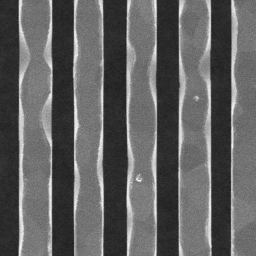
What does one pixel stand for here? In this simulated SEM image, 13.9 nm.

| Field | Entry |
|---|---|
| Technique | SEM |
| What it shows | wiring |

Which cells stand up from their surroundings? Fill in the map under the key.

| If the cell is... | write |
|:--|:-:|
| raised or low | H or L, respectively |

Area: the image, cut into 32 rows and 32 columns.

LLLHHHLLLHHHHLLLHHHLLLLHHHLLLHHH
LLHHHHLLLHHHHLLLHHHLLLLHHHLLLHHH
LLHHHHLLLHHHHLLLHHHHLLHHHHLLLHHH
LLLHHHLLLHHHHLLLHHHLLLHHHHLLLHHH
LLLHHHLLLHHHHLLLHHHLLLHHHHLLLHHH
LLLHHHLLLHHHHLLLHHHLLLHHHHLLLHHH
LLLHHHLLLLHHHLLLHHHLLLHHHHLLLHHH
LLLHHHLLLHHHHLLLHHHLLLLHHHLLLHHH
LLLHHHLLLHHHHLLLHHHLLLLHHLLLLHHH
LLLHHHHLLHHHHLLLHHHLLLLHHHLLLHHH
LLHHHHHLLHHHHLLLHHHLLLLHHHLLLHHH
LLHHHHLLLHHHHLLLHHHLLLLHHHLLLHHH
LLHHHHLLLHHHHLLLHHHLLLLHHHLLLHHH
LLLHHHLLLHHHHLLLHHHHLLLHHHLLLHHH
LLLHHHLLLHHHHLLLHHHHLLLHHHLLLHHH
LLLHHHLLLHHHHLLLHHHHLLLHHHLLLHHH
LLLHHHLLLHHHHLLLHHHHLLLHHHLLLHHH
LLLHHHLLLHHHHLLLHHHHLLLHHHLLLHHH
LLLHHHLLLHHHHLLLHHHLLLLHHHLLLHHH
LLLHHHLLLHHHHLLLHHHLLLHHHHLLLHHH
LLLHHHLLLHHHLLLLHHHLLLHHHHLLLHHH
LLLHHHLLLLHHHLLLHHHLLLHHHHLLLHHH
LLLHHHLLLLHHHLLLHHHLLLHHHHLLLHHH
LLLHHHLLLLHHHLLLHHHLLLHHHHLLLHHH
LLLHHHLLLHHHHLLLHHHLLLHHHHLLLHHH
LLLHHHLLLHHHHLLLHHHLLLHHHHLLLHHH
LLLHHHLLLHHHHLLLHHHLLLHHHHLLLHHH
LLLHHHLLLHHHHLLLHHHHLLHHHHLLLHHH
LLLHHHLLLHHHHLLLHHHHLLHHHHLLLHHH
LLLHHHLLLHHHHLLLHHHHLLHHHHLLLHHH
LLLHHHLLLHHHHLLLHHHLLLHHHHLLLHHH
LLHHHHLLLHHHHLLLHHHLLLLHHHLLLHHH